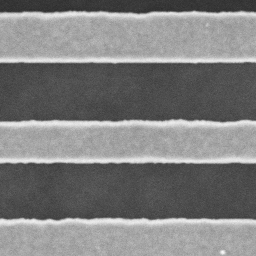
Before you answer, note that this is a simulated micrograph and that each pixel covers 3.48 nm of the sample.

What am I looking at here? lines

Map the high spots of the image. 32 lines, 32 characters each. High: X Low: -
--------------------------------
--------XX--X-----------X-----X-
XXXXXXXXXXXXXXXXXXXXXXXXXXXXXXXX
XXXXXXXXXXXXXXXXXXXXXXXXXXXXXXXX
XXXXXXXXXXXXXXXXXXXXXXXXXXXXXXXX
XXXXXXXXXXXXXXXXXXXXXXXXXXXXXXXX
XXXXXXXXXXXXXXXXXXXXXXXXXXXXXXXX
XXXXXXXXXXXXXXXXXXXXXXXXXXXXXXXX
--------------------------------
--------------------------------
--------------------------------
--------------------------------
--------------------------------
--------------------------------
--------------------------------
XXXXXXXXXXXXXXXXXXXXXXXXXXXXXXXX
XXXXXXXXXXXXXXXXXXXXXXXXXXXXXXXX
XXXXXXXXXXXXXXXXXXXXXXXXXXXXXXXX
XXXXXXXXXXXXXXXXXXXXXXXXXXXXXXXX
XXXXXXXXXXXXXXXXXXXXXXXXXXXXXXXX
--------------------------------
--------------------------------
--------------------------------
--------------------------------
--------------------------------
--------------------------------
--------------------------------
XXXXX-X-XXXXXXXXXXXXXXXXXXXXXXXX
XXXXXXXXXXXXXXXXXXXXXXXXXXXXXXXX
XXXXXXXXXXXXXXXXXXXXXXXXXXXXXXXX
XXXXXXXXXXXXXXXXXXXXXXXXXXXXXXXX
XXXXXXXXXXXXXXXXXXXXXXXXXXXXXXXX